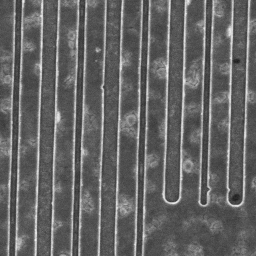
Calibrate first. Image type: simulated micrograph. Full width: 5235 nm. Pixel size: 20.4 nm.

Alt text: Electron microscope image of parallel lines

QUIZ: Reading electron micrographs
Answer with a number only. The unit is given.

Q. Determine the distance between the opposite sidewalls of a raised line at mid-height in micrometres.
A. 0.422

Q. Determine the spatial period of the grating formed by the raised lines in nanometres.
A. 655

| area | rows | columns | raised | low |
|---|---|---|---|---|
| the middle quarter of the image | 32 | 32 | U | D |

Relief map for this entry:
UUUDDUUUUUDDDDUUUUUDDUUUUUDDDDUU
UUUDDUUUUUDDDDUUUUUDDUUUUUDDDDUU
UUUDDUUUUUDDDDUUUUUDDUUUUUDDDDUU
UUUDDUUUUUDDDDUUUUUDDUUUUUDDDDUU
UUUDDUUUUUDDDDUUUUUDDUUUUUDDDDUU
UUUDDUUUUUDDDDUUUUUDDUUUUUDDDDUU
UUUDDUUUUUDDDDUUUUUDDUUUUUDDDDUU
UUUDDUUUUUDDDDUUUUUDDUUUUUDDDDUU
UUUDDUUUUUDDDDUUUUUDDUUUUUDDDDUU
UUUDDUUUUUDDDDUUUUUDDUUUUUDDDDUU
UUUDDUUUUUDDDDUUUUUDDUUUUUDDDDUU
UUUDDUUUUUDDDDUUUUUDDUUUUUDDDDUU
UUUDDUUUUUDDDDUUUUUDDUUUUUDDDDUU
UUUDDUUUUUDDDDUUUUUDDUUUUUDDDDUU
UUUDDUUUUUDDDDUUUUUDDUUUUUDDDDUU
UUUDDUUUUUDDDDUUUUUDDUUUUUDDDDUU
UUUDDUUUUUDDDDUUUUUDDUUUUDDDDDUU
UUUDUUUUUUDDDDUUUUUDDUUUUDDDDDUU
UUUDUUUUUUDDDDUUUUUDDUUUUDDDDUUU
UUDDUUUUUUDDDDUUUUUDUUUUUDDDDUUU
UUDDUUUUUUDDDDUUUUUDUUUUUDDDDUUU
UUDDUUUUUDDDDDUUUUDDUUUUUDDDDUUU
UUDDUUUUUDDDDDUUUUDDUUUUUDDDDUUU
UUUDUUUUUDDDDDUUUUDDUUUUUDDDDUUU
UUUDUUUUUDDDDUUUUUDDUUUUUDDDDUUU
UUUDUUUUUDDDDUUUUUDDUUUUUDDDDUUU
UUUDUUUUUDDDDUUUUUDDUUUUUDDDDUUU
UUDDUUUUUDDDDUUUUUDDUUUUUDDDDUUU
UUDDUUUUUDDDDUUUUUDDUUUUUDDDDUUU
UUDDUUUUUDDDDUUUUUDDUUUUUDDDDUUU
UUDDUUUUUDDDDUUUUUDDUUUUUDDDDUUU
UUDDUUUUUDDDDUUUUUDDUUUUUDDDDUUU